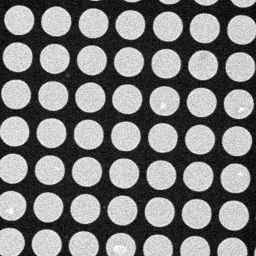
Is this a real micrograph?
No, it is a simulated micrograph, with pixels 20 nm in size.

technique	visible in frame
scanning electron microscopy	an array of small figures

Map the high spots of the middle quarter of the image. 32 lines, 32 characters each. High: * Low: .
*...******...*******..*******..*
....******...******...*******..*
......**......****.....*****....
........................**......
................................
....*****.....***...............
*..*******...******....*****....
*..*******..*******...******...*
*..*******..*******..********..*
*..*******..*******..********..*
....******...******...*******..*
.....****....*****....******...*
........................***.....
................................
....****.......*................
...******....*****.....****.....
...*******..*******...******...*
*..*******..*******..*******...*
...*******..*******..*******..**
...******...*******..*******..**
....*****....*****....******...*
..............***......****....*
................................
.....**.........................
...******....****......***......
..*******...******...******....*
..*******..********..*******..**
..*******..********..*******..**
..*******...*******..*******..**
...*****....******...*******..**
.............****.....*****....*
................................